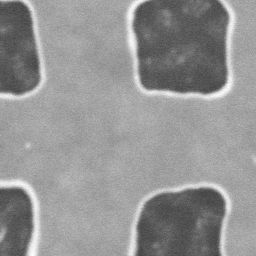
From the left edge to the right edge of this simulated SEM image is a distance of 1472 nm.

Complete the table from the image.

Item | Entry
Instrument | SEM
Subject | holes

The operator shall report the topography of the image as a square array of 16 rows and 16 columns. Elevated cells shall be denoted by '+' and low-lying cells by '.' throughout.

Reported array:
..+++++++.....++
..++++++......++
..++++++......++
..++++++......++
...++++++.....++
..+++++++.....++
++++++++++++++++
++++++++++++++++
++++++++++++++++
++++++++++++++++
++++++++++++++++
++++++++++++++++
..+++++++.....++
..+++++++.....++
..++++++......++
..++++++......++